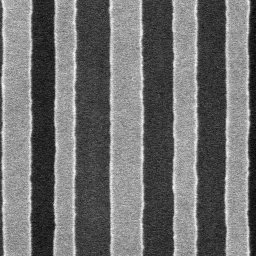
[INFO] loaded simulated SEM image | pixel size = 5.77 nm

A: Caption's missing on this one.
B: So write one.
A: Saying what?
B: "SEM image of lines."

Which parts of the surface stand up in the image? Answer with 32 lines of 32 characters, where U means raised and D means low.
UUUUDDDUUDDDDDUUUUDDDDUUUDDDUUUD
UUUUDDDUUDDDDDUUUUDDDDUUUDDDUUUD
UUUUDDDUUDDDDDUUUUDDDDUUUDDDUUUD
UUUUDDDUUDDDDDUUUUDDDDUUUDDDUUUD
UUUUDDDUUDDDDDUUUUDDDDUUUDDDUUUD
UUUUDDDUUDDDDDUUUUDDDDUUUDDDUUUD
UUUUDDDUUDDDDDUUUUDDDDUUUDDDUUUD
UUUUDDDUUDDDDDUUUUDDDDUUUDDDUUUD
UUUUDDDUUDDDDDUUUUDDDDUUUDDDUUUD
UUUUDDDUUDDDDDUUUUDDDDUUDDDDUUUD
UUUUDDDUUDDDDDUUUUDDDDUUUDDDUUUD
UUUUDDDUUDDDDDUUUUDDDDUUUDDDUUUD
UUUUDDDUUDDDDDUUUUDDDDUUUDDDUUUD
UUUUDDDUUDDDDDUUUUDDDDUUUDDDUUUD
UUUUDDDUUDDDDDUUUUDDDDUUUDDDUUUD
UUUUDDDUUDDDDDUUUUDDDDUUUDDDUUUD
UUUUDDDUUDDDDDUUUUDDDDUUUDDDUUUD
UUUUDDDUUDDDDDUUUUDDDDUUUDDDUUUD
UUUUDDDUUDDDDDUUUUDDDDUUDDDDUUUD
UUUUDDDUUDDDDDUUUUDDDDUUDDDDUUUD
UUUUDDDUUDDDDDUUUUDDDDUUDDDDUUUD
UUUUDDDUUDDDDDUUUUDDDDUUDDDDUUUD
UUUUDDDUUDDDDDUUUUDDDDUUUDDDUUUD
UUUUDDDUUDDDDDUUUUDDDDUUUDDDUUUD
UUUUDDDUUDDDDDUUUUDDDDUUDDDDUUUD
UUUUDDDUUDDDDDUUUUDDDDUUDDDDUUUD
UUUUDDDUUDDDDDUUUUDDDDUUDDDDUUUD
UUUUDDDUUDDDDDUUUUDDDDUUDDDDUUUD
UUUUDDDUUDDDDDUUUUDDDDUUUDDDUUUD
UUUUDDDUUDDDDDUUUUDDDDUUUDDDUUUD
UUUUDDDUUDDDDDUUUUDDDDUUDDDDUUUD
UUUUDDDUUDDDDDUUUUDDDDUUUDDDUUUD